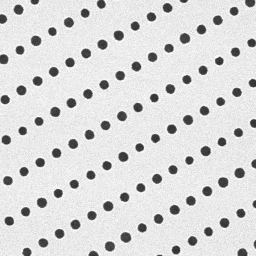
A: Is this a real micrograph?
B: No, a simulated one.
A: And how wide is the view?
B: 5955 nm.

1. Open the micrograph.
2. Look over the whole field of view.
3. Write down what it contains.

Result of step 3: a regular array of holes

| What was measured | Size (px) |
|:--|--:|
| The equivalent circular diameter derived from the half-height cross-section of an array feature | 10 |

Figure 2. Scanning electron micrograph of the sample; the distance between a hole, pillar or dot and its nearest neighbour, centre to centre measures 432 nm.